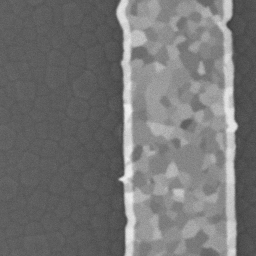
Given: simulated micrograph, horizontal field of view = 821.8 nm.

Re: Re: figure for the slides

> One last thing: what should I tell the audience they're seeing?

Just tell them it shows one or a few lines or trenches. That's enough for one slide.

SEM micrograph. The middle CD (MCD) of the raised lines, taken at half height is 327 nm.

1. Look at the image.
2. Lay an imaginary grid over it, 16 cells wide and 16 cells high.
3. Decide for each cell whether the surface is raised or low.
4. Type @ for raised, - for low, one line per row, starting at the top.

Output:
--------@@@@@@--
--------@@@@@@--
--------@@@@@@--
--------@@@@@@--
--------@@@@@@--
--------@@@@@@--
--------@@@@@@--
--------@@@@@@--
--------@@@@@@--
--------@@@@@@--
--------@@@@@@--
--------@@@@@@--
--------@@@@@@--
--------@@@@@@--
--------@@@@@@--
--------@@@@@@@-